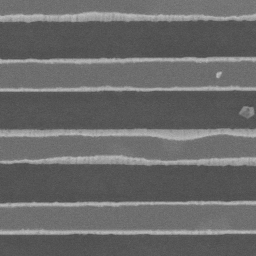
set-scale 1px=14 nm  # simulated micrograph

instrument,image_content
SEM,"lines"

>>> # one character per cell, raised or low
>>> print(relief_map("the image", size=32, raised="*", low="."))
********************************
********************************
................................
................................
................................
................................
................................
...........*********************
********************************
********************************
********************************
................................
................................
................................
................................
................................
..........................***...
********************************
********************************
********************************
................................
................................
................................
................................
................................
..******************************
********************************
********************************
********************************
................................
................................
................................